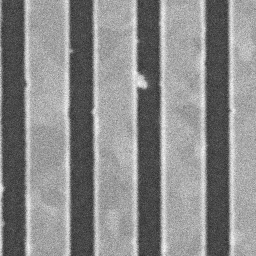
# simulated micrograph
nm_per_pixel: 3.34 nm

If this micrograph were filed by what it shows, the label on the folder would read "one or a few lines or trenches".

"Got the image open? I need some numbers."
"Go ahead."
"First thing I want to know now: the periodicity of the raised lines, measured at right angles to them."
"226 nanometers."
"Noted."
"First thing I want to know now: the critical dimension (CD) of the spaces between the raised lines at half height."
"95.1 nm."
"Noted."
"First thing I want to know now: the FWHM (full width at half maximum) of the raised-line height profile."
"131 nanometres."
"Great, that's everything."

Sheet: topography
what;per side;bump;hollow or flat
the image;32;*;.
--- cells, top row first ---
....****....*****...*****....***
...*****....*****...*****....***
...*****....*****...*****....***
...*****....*****...*****....***
...*****....*****...*****....***
...*****....*****...*****....***
...*****....*****...*****....***
...*****....*****...*****....***
...*****....*****...*****....***
...*****....*****...*****....***
....****....*****...*****....***
....****....*****....****....***
....****....*****....****....***
....****....*****....****....***
....****....*****....****....***
....****....*****....****....***
....****....*****....****....***
....****....*****....****....***
....****....*****....****....***
....****....*****....****....***
....****....*****....****....***
....****....*****....****....***
....****....*****....****....***
....****....*****....****....***
....****....*****....****....***
....****....*****....****....***
....****....*****....****....***
....****....*****....****....***
....****....*****....****....***
....****....*****....****....***
....****....*****....****....***
....****....*****....****....***